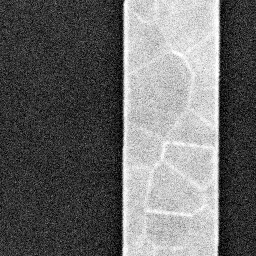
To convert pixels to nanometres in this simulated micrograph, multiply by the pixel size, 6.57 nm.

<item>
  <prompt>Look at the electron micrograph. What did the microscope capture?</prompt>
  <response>wiring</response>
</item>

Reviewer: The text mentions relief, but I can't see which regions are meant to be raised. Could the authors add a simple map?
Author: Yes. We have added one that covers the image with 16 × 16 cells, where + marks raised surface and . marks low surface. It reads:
........++++++..
........++++++..
........++++++..
........++++++..
........++++++..
........++++++..
........++++++..
........++++++..
........++++++..
........++++++..
........++++++..
........++++++..
........++++++..
........++++++..
........++++++..
........++++++..